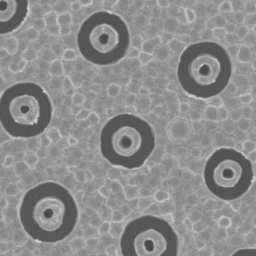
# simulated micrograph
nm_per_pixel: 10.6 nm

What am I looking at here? ring-shaped grooves with a dot in the middle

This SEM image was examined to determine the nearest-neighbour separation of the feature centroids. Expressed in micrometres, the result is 1.11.